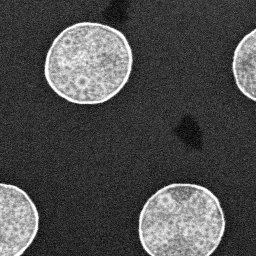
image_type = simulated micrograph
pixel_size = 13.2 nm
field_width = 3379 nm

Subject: raised bodies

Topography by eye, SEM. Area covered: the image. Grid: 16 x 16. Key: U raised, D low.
DDDDDDDDDDDDDDDD
DDDDDDDDDDDDDDDD
DDDDUUUUDDDDDDDU
DDDUUUUUDDDDDDDU
DDDUUUUUDDDDDDDU
DDDUUUUDDDDDDDDU
DDDDDDDDDDDDDDDD
DDDDDDDDDDDDDDDD
DDDDDDDDDDDDDDDD
DDDDDDDDDDDDDDDD
DDDDDDDDDDDDDDDD
DDDDDDDDDDDDDDDD
UUDDDDDDDUUUUDDD
UUDDDDDDDUUUUUDD
UUDDDDDDDUUUUUDD
UUDDDDDDDUUUUDDD